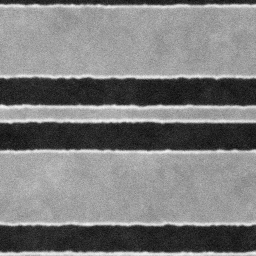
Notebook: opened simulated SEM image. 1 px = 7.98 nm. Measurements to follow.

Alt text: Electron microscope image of lines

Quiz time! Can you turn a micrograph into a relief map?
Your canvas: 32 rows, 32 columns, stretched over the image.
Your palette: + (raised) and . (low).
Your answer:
................................
++++++++++++++++++++++++++++++++
++++++++++++++++++++++++++++++++
++++++++++++++++++++++++++++++++
++++++++++++++++++++++++++++++++
++++++++++++++++++++++++++++++++
++++++++++++++++++++++++++++++++
++++++++++++++++++++++++++++++++
++++++++++++++++++++++++++++++++
++++++++++++++++++++++++++++++++
................................
................................
................................
++++++++++++++++++++++++++++++++
++++++++++++++++++++++++++++++++
................................
................................
................................
................................
++++++++++++++++++++++++++++++++
++++++++++++++++++++++++++++++++
++++++++++++++++++++++++++++++++
++++++++++++++++++++++++++++++++
++++++++++++++++++++++++++++++++
++++++++++++++++++++++++++++++++
++++++++++++++++++++++++++++++++
++++++++++++++++++++++++++++++++
++++++++++++++++++++++++++++++++
................................
................................
................................
................................